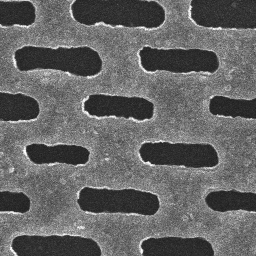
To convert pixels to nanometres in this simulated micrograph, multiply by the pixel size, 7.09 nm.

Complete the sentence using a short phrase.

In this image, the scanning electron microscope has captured holes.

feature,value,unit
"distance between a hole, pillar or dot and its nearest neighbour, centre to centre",542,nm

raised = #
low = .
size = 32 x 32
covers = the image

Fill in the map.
....#####...........####........
....#####............###........
....######...........###........
############################....
################################
################################
##..........######.........#####
##...........#####.........#####
##...........#####.........#####
##########.#####################
################################
################################
....#######.......########....#.
.....######........#######......
.....#######.......#########....
################################
################################
################################
###........#######.........#####
####.......#######.........#####
#########.#########........#####
################################
################################
###########.####################
...#######..........######......
....######..........######......
##.########.........############
################################
################################
###..#...#######################
#...........######........######
##...........#####.........#####